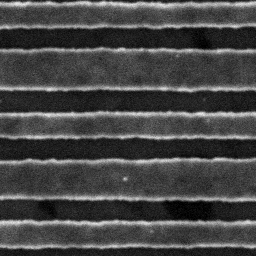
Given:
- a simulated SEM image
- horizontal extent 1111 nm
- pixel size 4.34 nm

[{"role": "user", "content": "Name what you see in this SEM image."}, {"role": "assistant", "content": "lines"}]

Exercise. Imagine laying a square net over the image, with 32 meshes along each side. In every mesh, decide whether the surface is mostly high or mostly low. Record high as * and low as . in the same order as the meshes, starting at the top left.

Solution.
********************.***********
********************************
********************************
**.*..*....*.......*............
................................
................................
********************************
********************************
********************************
********************************
********************************
................................
................................
................................
********************************
********************************
********************************
................................
................................
................................
********************************
********************************
********************************
********************************
********************************
................................
................................
................................
********************************
********************************
********************************
................................